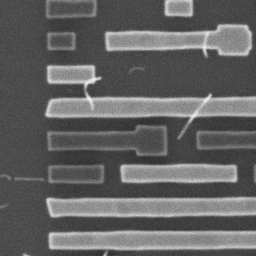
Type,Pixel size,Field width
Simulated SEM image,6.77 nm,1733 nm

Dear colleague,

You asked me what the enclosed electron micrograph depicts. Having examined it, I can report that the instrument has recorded wiring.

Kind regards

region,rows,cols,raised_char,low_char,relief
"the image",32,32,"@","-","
------@@@@@@---------@@@--------
------@@@@@@---------@@@--------
--------------------------------
---------------------------@@@@-
------@@@----@@@@@@@@@@@@@@@@@@-
------@@@----@@@@@@@@@@@@@@@@@@-
---------------------------@@@@-
--------------------------------
------@@@@@@--------------------
------@@@@@@--------------------
--------------------------------
--------------------------------
-------@@@@@@@@@@@@@@@@@@@@@@@@@
------@@@@@@@@@@@@@@@@@@@@@@@@@@
------@@@@@@@@@@@@@---@@@-------
--------------------------------
-------------@@@@@@@@----@@@@@@@
------@@@@@@@@@@@@@@@----@@@@@@@
------@@@@@@@@@@@@@@@----@@@@---
--------------------------------
--------------------------------
------@@@@@@@--@@@@@@@@@@@@@@@--
------@@@@@@@--@@@@@@@@@@@@@@---
--------------------------------
--------------------------------
------@@@@@@@@@@@@@@@@@@@@@@@@@@
------@@@@@@@@@@@@@@@@@@@@@@@@@@
--------------------------------
--------------------------------
------@@@@@@@@@@@@@@@@@@@@@@@@@@
------@@@@@@@@@@@@@@@@@@@@@@@@@@
--------------------------------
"